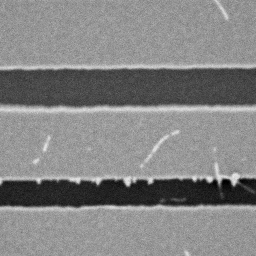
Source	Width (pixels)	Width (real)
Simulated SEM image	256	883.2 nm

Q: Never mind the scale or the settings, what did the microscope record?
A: lines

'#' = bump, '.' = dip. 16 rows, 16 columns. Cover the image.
################
################
################
################
................
................
................
################
################
################
################
................
................
################
################
################